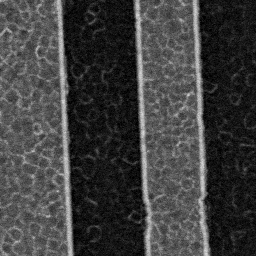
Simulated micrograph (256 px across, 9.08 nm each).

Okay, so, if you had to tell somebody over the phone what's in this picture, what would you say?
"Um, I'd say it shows one or a few lines or trenches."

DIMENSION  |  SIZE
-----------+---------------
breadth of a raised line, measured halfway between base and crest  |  527 nanometers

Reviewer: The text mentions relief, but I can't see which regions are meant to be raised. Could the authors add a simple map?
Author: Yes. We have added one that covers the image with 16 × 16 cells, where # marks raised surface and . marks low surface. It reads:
####.....###....
####.....###....
####.....###....
####.....###....
####.....###....
####.....###....
####.....###....
####.....###....
####.....####...
####.....####...
####.....####...
####.....####...
####.....####...
####.....####...
####.....####...
####.....####...